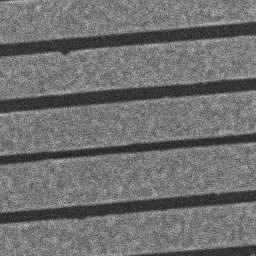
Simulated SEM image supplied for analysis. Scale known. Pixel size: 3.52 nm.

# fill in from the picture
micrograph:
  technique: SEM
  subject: parallel lines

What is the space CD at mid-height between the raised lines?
43.8 nm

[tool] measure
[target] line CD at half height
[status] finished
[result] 0.151 um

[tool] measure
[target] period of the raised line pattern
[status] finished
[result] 194 nm